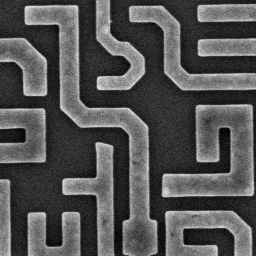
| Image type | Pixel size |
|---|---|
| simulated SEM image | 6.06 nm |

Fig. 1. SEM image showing wiring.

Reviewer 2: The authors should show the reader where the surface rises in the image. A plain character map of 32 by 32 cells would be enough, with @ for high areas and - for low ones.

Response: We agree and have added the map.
------------@@------------------
---@@@@@@@--@@--@@@@@----@@@@@@@
---@@@@@@@--@@--@@@@@@---@@@@@@@
-------@@@--@@------@@----------
-------@@@--@@-------@----------
@@@@---@@@---@@@-----@---@@@@@@@
@@@@@--@@@----@@@----@---@@@@@@@
@@@@@@-@@@------@@---@----------
---@@@-@@@------@@---@@---------
---@@@-@@@-----@@@---@@@@@@@@@@@
---@@@--@@--@@@@@-----@@@@@@@@@@
---@@@--@@----------------------
--------@@----------------------
--------@@@--------------@@@@@@-
@@@@@@---@@@@@@@@--------@@@@@@@
@@@@@@---@@@@@@@@@-------@@@@@@@
---@@@----------@@-------@@--@@@
---@@@----------@@-------@@--@@@
@@@@@@------@@--@@-------@@--@@@
@@@@@@------@@--@@-------@@--@@@
------------@@--@@-----------@@@
------------@@--@@----------@@@@
@-------@@@@@@--@@--@@@@@@@@@@@@
@-------@@@@@@--@@@-@@@@@@@@@@@@
@-----------@@--@@@--@@---------
@-----------@@--@@@-------------
@-----------@@--@@@--@@@@@@@@---
@---@@--@@--@@--@@@--@@@@@@@@@--
@---@@--@@--@@-@@@@@-@@@@@@-@@@-
@---@@--@@--@@-@@@@@-@@------@@-
@---@@--@@--@@-@@@@@-@@------@@-
@---@@@@@@--@@--@@@--@@@@@@--@@-